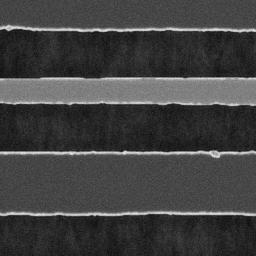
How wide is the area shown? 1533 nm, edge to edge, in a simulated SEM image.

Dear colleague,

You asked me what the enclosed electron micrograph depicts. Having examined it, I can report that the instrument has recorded lines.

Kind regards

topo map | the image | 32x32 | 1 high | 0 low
11111111111111111111111111111111
11111111111111111111111111111111
11111111111111111111111111111111
11111111111111111111111111111111
00000000000000000000000000000000
00000000000000000000000000000000
00000000000000000000000000000000
00000000000000000000000000000000
00000000000000000000000000000000
00000000000000000000000000000000
11111111111111111111111111111111
11111111111111111111111111111111
11111111111111111111111111111111
00000000000000000000000000000000
00000000000000000000000000000000
00000000000000000000000000000000
00000000000000000000000000000000
00000000000000000000000000000000
00000000000000000000000000000000
11111111111111111111111111111111
11111111111111111111111111111111
11111111111111111111111111111111
11111111111111111111111111111111
11111111111111111111111111111111
11111111111111111111111111111111
11111111111111111111111111111111
11111111111111111111111111111111
00000000000000000000000000000000
00000000000000000000000000000000
00000000000000000000000000000000
00000000000000000000000000000000
00000000000000000000000000000000